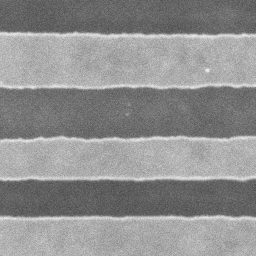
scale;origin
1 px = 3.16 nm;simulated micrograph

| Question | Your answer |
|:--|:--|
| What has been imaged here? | lines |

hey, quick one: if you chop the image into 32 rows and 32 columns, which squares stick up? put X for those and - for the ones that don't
--------------------------------
--------------------------------
--------------------------------
--------------------------------
XXXXXXXXXXXXXXXXXXXXXXXXXX-XXXXX
XXXXXXXXXXXXXXXXXXXXXXXXXXXXXXXX
XXXXXXXXXXXXXXXXXXXXXXXXXXXXXXXX
XXXXXXXXXXXXXXXXXXXXXXXXXXXXXXXX
XXXXXXXXXXXXXXXXXXXXXXXXXXXXXXXX
XXXXXXXXXXXXXXXXXXXXXXXXXXXXXXXX
XXXXXXXXXXXXXXXXXXXXXXXXXXXXXXXX
--------------------------------
--------------------------------
--------------------------------
--------------------------------
--------------------------------
--------------------------------
XXXXXXXXXXXXXXXXXXXXXXXXXXXXXXXX
XXXXXXXXXXXXXXXXXXXXXXXXXXXXXXXX
XXXXXXXXXXXXXXXXXXXXXXXXXXXXXXXX
XXXXXXXXXXXXXXXXXXXXXXXXXXXXXXXX
XXXXXXXXXXXXXXXXXXXXXXXXXXXXXXXX
--------------------------------
--------------------------------
--------------------------------
--------------------------------
--------------------------------
XXXXXXXXXXXXXXXXXXXXXXXXXXXXXXXX
XXXXXXXXXXXXXXXXXXXXXXXXXXXXXXXX
XXXXXXXXXXXXXXXXXXXXXXXXXXXXXXXX
XXXXXXXXXXXXXXXXXXXXXXXXXXXXXXXX
XXXXXXXXXXXXXXXXXXXXXXXXXXXXXXXX